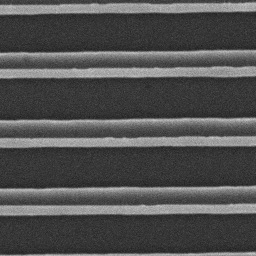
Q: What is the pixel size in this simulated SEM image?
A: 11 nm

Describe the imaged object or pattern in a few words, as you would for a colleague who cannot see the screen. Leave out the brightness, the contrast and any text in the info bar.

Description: lines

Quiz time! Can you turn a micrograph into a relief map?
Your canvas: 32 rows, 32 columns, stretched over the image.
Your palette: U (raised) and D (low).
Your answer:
UUUUUUUUUUUUUUUUUUUUUUUUUUUUUUUU
UUUUUUUUUUUUDDDDDDDDDDDDDDDDDDDD
DDDDDDDDDDDDDDDDDDDDDDDDDDDDDDDD
DDDDDDDDDDDDDDDDDDDDDDDDDDDDDDDD
DDDDDDDDDDDDDDDDDDDDDDDDDDDDDDDD
DDDDDDDDDDDDDDDDDDDDDDDDDDDDDDDD
DDDDDDDDDDDDDDDDDDDDDDDDUUUUUUUU
UUUUUUUUUUUUUUUUUUUUUUUUUUUUUUUU
UUUUUUUUUUUUUUUUUUUUUUUUUUUUUUUU
UUUUUUUUUUUUDDDDUDDDDDDDDDDDDDDD
DDDDDDDDDDDDDDDDDDDDDDDDDDDDDDDD
DDDDDDDDDDDDDDDDDDDDDDDDDDDDDDDD
DDDDDDDDDDDDDDDDDDDDDDDDDDDDDDDD
DDDDDDDDDDDDDDDDDDDDDDDDDDDDDDDD
DDDDDDDDDDDDDDDDDDDDDDDDDDDDDDDD
UUUUUUUUUUUUUUUUUUUUUUUUUUUUUUUU
UUUUUUUUUUUUUUUUUUUUUUUUUUUUUUUU
UUUUUUUUUUUUUUUUUUUUUUUUUUUUUUUU
DDDDDDDDDDDDDDDDDDDDDDDDDDDDDDDD
DDDDDDDDDDDDDDDDDDDDDDDDDDDDDDDD
DDDDDDDDDDDDDDDDDDDDDDDDDDDDDDDD
DDDDDDDDDDDDDDDDDDDDDDDDDDDDDDDD
DDDDDDDDDDDDDDDDDDDDDDDDDDDDDDDD
DDDDDDDDDDDDDDDDDDDDDDDDDDDUUUUU
UUUUUUUUUUUUUUUUUUUUUUUUUUUUUUUU
UUUUUUUUUUUUUUUUUUUUUUUUUUUUUUUU
UUUUUUUUUUUUUUUUUUUUUUUUUUUUUUUD
DDDDDDDDDDDDDDDDDDDDDDDDDDDDDDDD
DDDDDDDDDDDDDDDDDDDDDDDDDDDDDDDD
DDDDDDDDDDDDDDDDDDDDDDDDDDDDDDDD
DDDDDDDDDDDDDDDDDDDDDDDDDDDDDDDD
DDDDDDDDDDDDDDDDDDDDDDDDDDDDDDDD